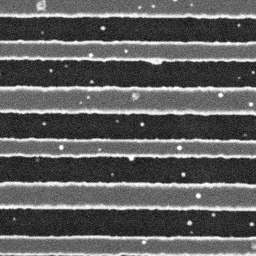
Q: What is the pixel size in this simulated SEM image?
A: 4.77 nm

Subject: lines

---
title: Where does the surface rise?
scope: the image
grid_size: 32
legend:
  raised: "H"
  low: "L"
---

HHHHHHHHHHHHHHHHHHHHHHHHHHHHHHHH
HHHHHHHHHHHHHHHHHHHHHHHHHHHHHHHH
LLLLLLLLLLLLLLLLLLLLLLLLLLLLLLLL
LLLLLLLLLLLLLLLLLLLLLLLLLLLLLLLL
LLLLLLLLLLLLLLLLLLLLLLLLLLLLLLLL
HHHHHHHHHHHHHHHHHHHHHHHHHHHHHHHH
HHHHHHHHHHHHHHHHHHHHHHHHHHHHHHHH
LLLLLLHHLHLHHHHHHHHHHHHHHHHHHHHH
LLLLLLLLLLLLLLLLLLLLLLLLLLLLLLLL
LLLLLLLLLLLLLLLLLLLLLLLLLLLLLLLL
LLLLLLLLLLLLLLLLLLLLLLLLLLLLLLLL
HHHHHHHHHHHHHHHHHHHHHHHHHHHHHHHH
HHHHHHHHHHHHHHHHHHHHHHHHHHHHHHHH
HHHHHHHHHHHHHHHHHHHHHHHHHHHHHHHH
LLLLLLLLLLLLLLLLLLLLLLLLLLLLLLLL
LLLLLLLLLLLLLLLLLLLLLLLLLLLLLLLL
LLLLLLLLLLLLLLLLLLLLLLLLLLLLLLLL
HHHHHHHHHLLHHHLLLLLLLLLLHHLLLLLL
HHHHHHHHHHHHHHHHHHHHHHHHHHHHHHHH
HHLHHHHHHHHHHHHHHHHHHHHHHHHHHHHH
LLLLLLLLLLLLLLLLLLLLLLLLLLLLLLLL
LLLLLLLLLLLLLLLLLLLLLLLLLLLLLLLL
LLLLLLLLLLLLLLLLLLLLLLLLLLLLLLLL
HHHHHHHHHHHHHHHHHHHHHHHHHHHHHHHH
HHHHHHHHHHHHHHHHHHHHHHHHHHHHHHHH
HHHHHHHHHHHHHHHHHHHHHHHHHHHHHHHH
LLLLLLLLLLLLLLLLLLLLLLLLLLLLLLLL
LLLLLLLLLLLLLLLLLLLLLLLLLLLLLLLL
LLLLLLLLLLLLLLLLLLLLLLLLLLLLLLLL
LLLLLLLLLLLLLLLLLLLLLLLLLLLLLLLL
HHHHHHHHHHHHHHHHHHHHHHHHHHHHHHHH
HHHHHHHHHHHHHHHHHHHHHHHHHHHHHHHH